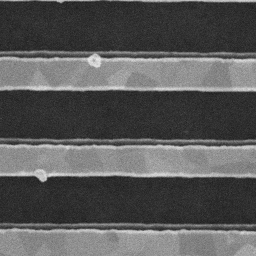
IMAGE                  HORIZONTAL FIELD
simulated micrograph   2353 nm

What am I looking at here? lines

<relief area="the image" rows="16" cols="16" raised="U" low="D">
DDDDDDDDDDDDDDDD
DDDDDDDDDDDDDDDD
DDDDDDDDDDDDDDDD
DDDDDDDDDDDDDDDD
UUUUUUUUUUUUUUUU
UUUUUUUUUUUUUUUU
DDDDDDDDDDDDDDDD
DDDDDDDDDDDDDDDD
DDDDDDDDDDDDDDDD
UUUUUUUUUUUUUUUU
UUUUUUUUUUUUUUUU
DDDDDDDDDDDDDDDD
DDDDDDDDDDDDDDDD
DDDDDDDDDDDDDDDD
UUUUUUUUUUUUUUUU
UUUUUUUUUUUUUUUU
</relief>